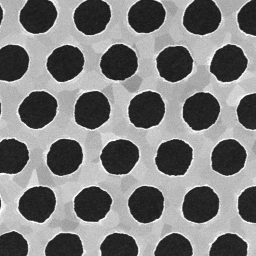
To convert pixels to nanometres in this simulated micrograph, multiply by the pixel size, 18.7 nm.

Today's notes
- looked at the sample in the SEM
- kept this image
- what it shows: a regular array of holes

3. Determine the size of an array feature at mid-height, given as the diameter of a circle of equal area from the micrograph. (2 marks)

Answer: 702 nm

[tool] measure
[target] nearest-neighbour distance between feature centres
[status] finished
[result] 1.01 micrometres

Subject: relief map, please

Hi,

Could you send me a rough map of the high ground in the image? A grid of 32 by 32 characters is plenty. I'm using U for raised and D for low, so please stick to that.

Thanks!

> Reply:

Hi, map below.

UUUDDDDUUUDDDUUUUDDDUUUUDDDUUUUD
UUUDDDDUUDDDDDUUDDDDDUUDDDDDUUDD
UUDDDDDUUDDDDDUUDDDDDUUDDDDDUUDD
UUUDDDUUUUDDDUUUDDDDUUUDDDDUUUDD
UUUUUUUUUUUUUUUUUUUUUUUUUUUUUUUU
UUUUUUUUUUUUUUUUUUUUUUUUUUUUUUUU
DDDUUUUDDDUUUDDDDUUUDDDDUUUDDDUU
DDDDUUDDDDDUUDDDDUUUDDDDUUDDDDDU
DDDDUUDDDDUUUDDDDUUUDDDDUUDDDDDU
DDDUUUUDDDUUUDDDUUUUDDDUUUUDDDUU
UUUUUUUUUUUUUUUUUUUUUUUUUUUUUUUU
UUUUDDUUUUUDDUUUUUDUUUUUUDUUUUUU
UUUDDDDUUUDDDDUUDDDDUUUDDDDUUUDD
UUDDDDDUUDDDDDUUDDDDDUUDDDDUUUDD
UUDDDDDUUDDDDDUUDDDDUUUDDDDUUUDD
UUUDDDUUUUDDDUUUUDDDUUUDDDDUUUDD
UUUUUUUUUUUUUUUUUUUUUUUUUUUUUUUU
DDUUUUUDDUUUUUUDUUUUUDDUUUUUDUUU
DDDUUUDDDDUUUDDDDUUUDDDDUUUDDDDU
DDDDUUDDDDUUUDDDDUUDDDDDUUDDDDDU
DDDUUUDDDDUUUDDDDUUDDDDDUUDDDDDU
DDUUUUUDDUUUUDDDUUUUDDDUUUUDDDUU
UUUUUUUUUUUUUUUUUUUUUUUUUUUUUUUU
UUUUDDUUUUUDDUUUUDDUUUUUDDUUUUUD
UUUDDDDUUUDDDDUUDDDDUUUDDDDUUUDD
UUDDDDDUUDDDDDUUDDDDDUUDDDDUUUDD
UUDDDDDUUDDDDDUUDDDDUUUDDDDUUUDD
UUUDDDUUUUDDDUUUUDDDUUUDDDUUUUDD
UUUUUUUUUUUUUUUUUUUUUUUUUUUUUUUU
DDDUUUUDDDUUUDDDUUUUUDDUUUUDDDUU
DDDUUUDDDDUUUDDDDUUUDDDDUUUDDDDU
DDDUUUDDDDUUUDDDDUUDDDDDUUDDDDDU